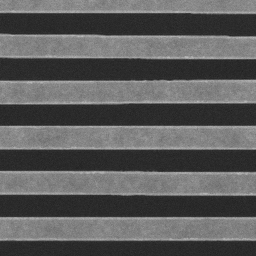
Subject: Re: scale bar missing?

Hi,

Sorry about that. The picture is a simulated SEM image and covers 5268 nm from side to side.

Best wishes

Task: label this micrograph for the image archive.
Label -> lines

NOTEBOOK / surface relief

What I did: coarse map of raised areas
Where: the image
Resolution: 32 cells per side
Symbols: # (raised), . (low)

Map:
################################
################################
................................
................................
#############...................
################################
################################
................................
................................
................................
################################
################################
################################
................................
................................
................................
################################
################################
################################
................................
................................
##################..............
################################
################################
................................
................................
................................
################################
################################
################################
................................
................................